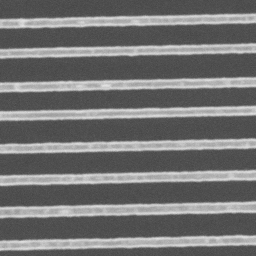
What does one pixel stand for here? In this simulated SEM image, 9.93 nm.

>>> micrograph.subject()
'parallel lines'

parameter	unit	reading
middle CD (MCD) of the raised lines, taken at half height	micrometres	0.077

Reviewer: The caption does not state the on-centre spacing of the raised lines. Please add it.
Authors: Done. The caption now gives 0.315 microns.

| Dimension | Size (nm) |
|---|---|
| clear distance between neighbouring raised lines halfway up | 231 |